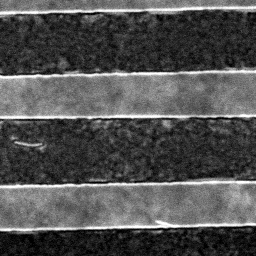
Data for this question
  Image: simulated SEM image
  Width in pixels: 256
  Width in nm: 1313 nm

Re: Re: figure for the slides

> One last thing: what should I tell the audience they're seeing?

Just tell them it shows lines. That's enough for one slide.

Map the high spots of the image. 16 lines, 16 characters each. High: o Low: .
oooooooooooooooo
................
................
................
............oooo
oooooooooooooooo
oooooooooooooooo
................
................
................
................
.......ooooooooo
oooooooooooooooo
oooooooooooooooo
................
................